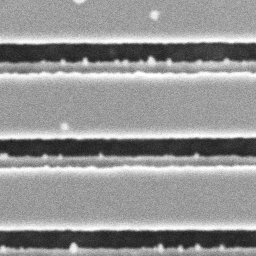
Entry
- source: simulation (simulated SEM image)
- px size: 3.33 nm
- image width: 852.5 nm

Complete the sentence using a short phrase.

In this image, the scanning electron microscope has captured lines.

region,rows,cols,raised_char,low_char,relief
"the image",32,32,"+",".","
++++++++++++++++++++++++++++++++
++++++++++++++++++++++++++++++++
++++++++++++++++++++++++++++++++
++++++++++++++++++++++++++++++++
++++++++++++++++++++++++++++++++
................................
................................
..................+.........+...
++++++++++++++++++++++++++++++++
++++++++++++++++++++++++++++++++
++++++++++++++++++++++++++++++++
++++++++++++++++++++++++++++++++
++++++++++++++++++++++++++++++++
++++++++++++++++++++++++++++++++
++++++++++++++++++++++++++++++++
++++++++++++++++++++++++++++++++
++++++++++++++++++++++++++++++++
................................
................................
+....+......+...........+..+++..
++++++++++++++++++++++++++++++++
++++++++++++++++++++++++++++++++
++++++++++++++++++++++++++++++++
++++++++++++++++++++++++++++++++
++++++++++++++++++++++++++++++++
++++++++++++++++++++++++++++++++
++++++++++++++++++++++++++++++++
++++++++++++++++++++++++++++++++
++++++++++++++++++++++++++++++++
................................
................................
++++++++++++++++++++++++++++++++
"